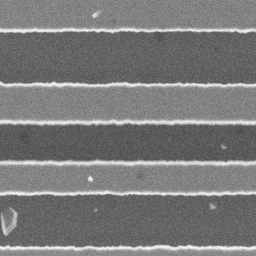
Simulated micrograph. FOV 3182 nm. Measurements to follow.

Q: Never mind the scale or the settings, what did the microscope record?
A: lines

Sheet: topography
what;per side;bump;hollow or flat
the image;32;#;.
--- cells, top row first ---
################################
################################
################################
################################
................................
................................
................................
................................
................................
................................
...............#................
################################
################################
################################
################################
................................
................................
................................
................................
................................
################################
################################
################################
################################
................................
................................
................................
................................
................................
................................
................................
################################